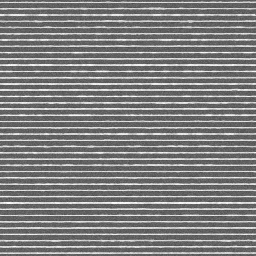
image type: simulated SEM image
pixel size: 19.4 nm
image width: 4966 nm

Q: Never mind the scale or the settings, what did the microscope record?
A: parallel lines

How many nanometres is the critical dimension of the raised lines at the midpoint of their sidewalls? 26.7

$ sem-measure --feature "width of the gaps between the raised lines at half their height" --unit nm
99.4